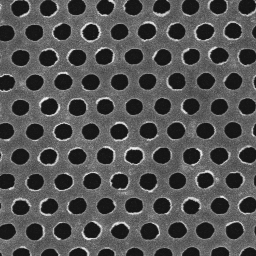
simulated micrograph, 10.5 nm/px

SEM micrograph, a regular array of holes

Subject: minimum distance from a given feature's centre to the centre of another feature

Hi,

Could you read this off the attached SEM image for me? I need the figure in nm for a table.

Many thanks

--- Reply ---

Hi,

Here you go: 289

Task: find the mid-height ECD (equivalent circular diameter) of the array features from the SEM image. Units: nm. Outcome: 179